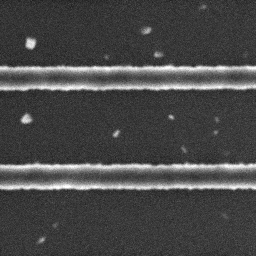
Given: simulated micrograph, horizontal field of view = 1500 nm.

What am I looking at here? lines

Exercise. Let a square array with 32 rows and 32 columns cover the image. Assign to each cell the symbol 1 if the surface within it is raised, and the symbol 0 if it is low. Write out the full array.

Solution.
00000000000000000000000000000000
00000000000000000000000000000000
00000000000000000000000000000000
00000000000000000000000000000000
00000000000000000000000000000000
00000000000000000000000000000000
00000000000000000000000000000000
00000000000000000000000000000000
10111011001111111011111101111111
11111111111111111111111111111111
11111111111111111111111111111111
00000000000000000000000000000000
00000000000000000000000000000000
00000000000000000000000000000000
00000000000000000000000000000000
00000000000000000000000000000000
00000000000000000000000000000000
00000000000000000000000000000000
00000000000000000000000000000000
00000000000000000000000000000000
00000000000000000000000000000000
11111111111111111111111111111111
11111111111111111111111111111111
11011111011000011111100000000000
00000000000000000000000000000000
00000000000000000000000000000000
00000000000000000000000000000000
00000000000000000000000000000000
00000000000000000000000000000000
00000000000000000000000000000000
00000000000000000000000000000000
00000000000000000000000000000000